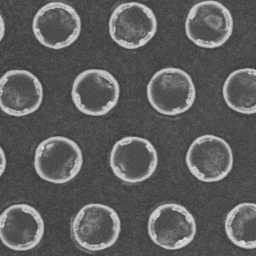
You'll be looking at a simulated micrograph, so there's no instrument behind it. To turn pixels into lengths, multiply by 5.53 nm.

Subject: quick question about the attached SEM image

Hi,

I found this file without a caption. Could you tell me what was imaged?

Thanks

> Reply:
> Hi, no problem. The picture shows a regular array of raised bodies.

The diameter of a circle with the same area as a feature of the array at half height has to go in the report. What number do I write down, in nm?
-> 246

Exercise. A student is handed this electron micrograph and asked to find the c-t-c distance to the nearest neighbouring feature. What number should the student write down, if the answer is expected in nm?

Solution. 419